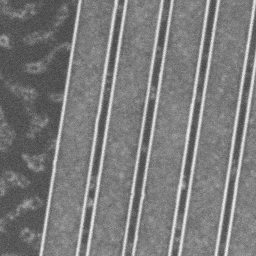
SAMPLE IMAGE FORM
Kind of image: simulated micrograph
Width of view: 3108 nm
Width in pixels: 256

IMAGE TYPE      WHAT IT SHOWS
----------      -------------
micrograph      parallel lines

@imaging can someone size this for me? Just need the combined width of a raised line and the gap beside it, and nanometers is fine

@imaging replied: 554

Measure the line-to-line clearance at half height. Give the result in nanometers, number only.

430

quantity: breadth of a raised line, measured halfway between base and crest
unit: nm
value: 129